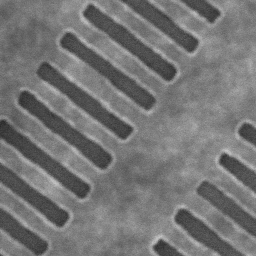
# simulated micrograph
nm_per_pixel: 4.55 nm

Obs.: holes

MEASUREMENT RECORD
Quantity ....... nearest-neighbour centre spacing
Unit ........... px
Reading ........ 35.7